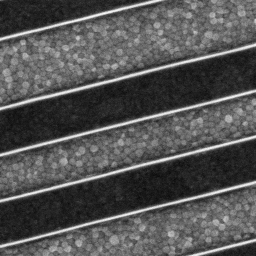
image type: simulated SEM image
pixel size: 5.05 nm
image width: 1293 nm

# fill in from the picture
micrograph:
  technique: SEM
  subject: one or a few lines or trenches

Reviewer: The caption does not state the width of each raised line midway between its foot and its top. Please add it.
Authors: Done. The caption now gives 45.1 px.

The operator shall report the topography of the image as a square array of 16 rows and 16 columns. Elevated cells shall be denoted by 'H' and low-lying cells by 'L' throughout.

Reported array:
HHHHHHHHLLLLLLLL
HHHHLLLLLLLLLLLL
LLLLLLLLLLLLLLLL
LLLLLLLLLLLLLHHH
LLLLLLLLLHHHHHHH
LLLLLHHHHHHHHHHH
LHHHHHHHHHHHHLLL
HHHHHHHHHLLLLLLL
HHHHHLLLLLLLLLLL
HLLLLLLLLLLLHHHH
LLLLLLLLHHHHHHHH
LLLLHHHHHHHHHHHH
HHHHHHHHHHHHLLLL
HHHHHHHHLLLLLLLL
HHHHLLLLLLLLLLLL
LLLLLLLLLLLLLLHH